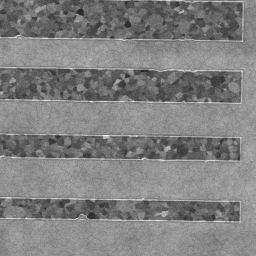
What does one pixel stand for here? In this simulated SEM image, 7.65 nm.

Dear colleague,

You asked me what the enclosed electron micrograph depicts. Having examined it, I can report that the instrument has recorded one or a few lines or trenches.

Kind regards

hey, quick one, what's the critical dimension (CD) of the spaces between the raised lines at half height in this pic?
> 264 nm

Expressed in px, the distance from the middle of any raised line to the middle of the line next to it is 62.6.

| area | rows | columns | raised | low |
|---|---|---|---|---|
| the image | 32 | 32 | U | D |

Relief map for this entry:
UUUUUUUUUUUUUUUUUUUUUUUUUUUUUUDD
UUUUUUUUUUUUUUUUUUUUUUUUUUUUUUDD
UUUUUUUUUUUUUUUUUUUUUUUUUUUUUUDD
UUUUUUUUUUUUUUUUUUUUUUUUUUUUUUDD
UUUUUUUUUUUUUUUUUUUUUUUUUUUUUUDD
DDDDDDDDDDDDDDDDDDDDDDDDDDDDDDDD
DDDDDDDDDDDDDDDDDDDDDDDDDDDDDDDD
DDDDDDDDDDDDDDDDDDDDDDDDDDDDDDDD
UUUUDDDDDDDDDDDDDDDDDDDDDDDDDDDD
UUUUUUUUUUUUUUUUUUUUUUUUUUUUUUDD
UUUUUUUUUUUUUUUUUUUUUUUUUUUUUUDD
UUUUUUUUUUUUUUUUUUUUUUUUUUUUUUDD
DDDDDDDUUUUUUUUUUUUUUUUUUUUUUUDD
DDDDDDDDDDDDDDDDDDDDDDDDDDDDDDDD
DDDDDDDDDDDDDDDDDDDDDDDDDDDDDDDD
DDDDDDDDDDDDDDDDDDDDDDDDDDDDDDDD
DDDDDDDDDDDDDDDDDDDDDDDDDDDDDDDD
UUUUUUUUUUUUUUUUUUUUUUUUUUUUUUDD
UUUUUUUUUUUUUUUUUUUUUUUUUUUUUUDD
UUUUUUUUUUUUUUUUUUUUUUUUUUUUUUDD
DDDDDDDDDDDDDDDDDDDDDDDDDDDDDDDD
DDDDDDDDDDDDDDDDDDDDDDDDDDDDDDDD
DDDDDDDDDDDDDDDDDDDDDDDDDDDDDDDD
DDDDDDDDDDDDDDDDDDDDDDDDDDDDDDDD
DDDDDDDDDDDDDDDDDDDDDDDDDDDDDDDD
UUUUUUUUUUUUUUUUUUUUUUUUUUUUUUDD
UUUUUUUUUUUUUUUUUUUUUUUUUUUUUUDD
DDDDDDDDDDDDDDDDDUUUUUUUUUUUUUDD
DDDDDDDDDDDDDDDDDDDDDDDDDDDDDDDD
DDDDDDDDDDDDDDDDDDDDDDDDDDDDDDDD
DDDDDDDDDDDDDDDDDDDDDDDDDDDDDDDD
DDDDDDDDDDDDDDDDDDDDDDDDDDDDDDDD